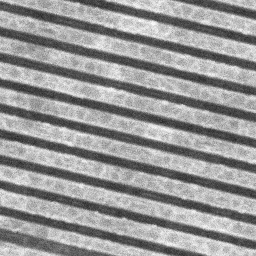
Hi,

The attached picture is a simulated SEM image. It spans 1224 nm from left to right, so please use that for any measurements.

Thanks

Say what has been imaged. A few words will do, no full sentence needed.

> parallel lines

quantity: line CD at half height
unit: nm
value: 76.2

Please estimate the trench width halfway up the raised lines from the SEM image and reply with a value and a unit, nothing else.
40.1 nm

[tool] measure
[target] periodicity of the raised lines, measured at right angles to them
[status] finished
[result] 0.119 µm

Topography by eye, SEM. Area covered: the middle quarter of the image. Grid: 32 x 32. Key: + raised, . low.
+++++++++++++++..........+++++++
..+++++++++++++++++...........++
.......++++++++++++++++.........
+..........+++++++++++++++++....
++++++.........+++++++++++++++++
++++++++++.........+++++++++++++
+++++++++++++..........+++++++++
++++++++++++++++++..........++++
.....++++++++++++++++...........
..........+++++++++++++++++.....
++++.........+++++++++++++++++..
++++++++.........+++++++++++++++
++++++++++++.........+++++++++++
++++++++++++++++..........++++++
....++++++++++++++++..........++
........+++++++++++++++++.......
+++.........+++++++++++++++++...
+++++++.........++++++++++++++++
+++++++++++.........++++++++++++
+++++++++++++++..........+++++++
..+++++++++++++++++..........+++
......++++++++++++++++++........
+.........++++++++++++++++++....
+++++.........++++++++++++++++++
+++++++++.........++++++++++++++
+++++++++++++..........+++++++++
.++++++++++++++++..........+++++
.....+++++++++++++++++.........+
.........+++++++++++++++++......
+++..........+++++++++++++++++..
+++++++..........+++++++++++++++
+++++++++++...........++++++++++